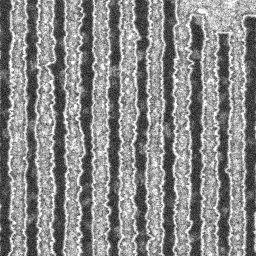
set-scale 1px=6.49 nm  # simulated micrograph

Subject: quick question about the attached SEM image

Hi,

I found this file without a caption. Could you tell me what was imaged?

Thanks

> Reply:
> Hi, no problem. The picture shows parallel lines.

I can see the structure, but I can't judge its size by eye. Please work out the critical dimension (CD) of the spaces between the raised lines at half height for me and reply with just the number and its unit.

12.9 px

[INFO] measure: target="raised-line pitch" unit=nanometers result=178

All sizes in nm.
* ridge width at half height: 94.1